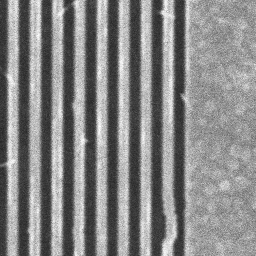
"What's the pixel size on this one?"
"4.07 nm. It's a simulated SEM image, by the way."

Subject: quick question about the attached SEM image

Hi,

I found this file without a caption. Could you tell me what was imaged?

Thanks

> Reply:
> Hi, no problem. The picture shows parallel lines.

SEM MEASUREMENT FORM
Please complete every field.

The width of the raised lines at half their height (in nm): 44.3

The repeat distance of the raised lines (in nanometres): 90.7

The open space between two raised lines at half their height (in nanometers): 44.8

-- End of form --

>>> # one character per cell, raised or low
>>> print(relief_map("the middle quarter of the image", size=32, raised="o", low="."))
...oo...ooo...oo...ooo...oo...oo
...oo...ooo...oo...ooo...oo...oo
...oo...ooo...oo...ooo...oo...oo
...oo...ooo...oo...ooo...oo...oo
...oo...ooo...oo...ooo...oo...oo
...oo...ooo...oo...ooo...oo...oo
...oo...ooo...oo...ooo...oo...oo
...oo...ooo...oo...ooo...oo...oo
...oo...ooo...oo...ooo...oo...oo
..ooo...ooo...oo...ooo...oo...oo
..ooo...ooo...oo...ooo...oo...oo
..ooo...ooo...oo...ooo...oo...oo
...oo...ooo...oo...ooo...oo...oo
...oo...ooo...oo...ooo...oo...oo
...oo...ooo...oo...ooo...oo...oo
...oo...ooo...oo...ooo...oo...oo
...oo...ooo...oo...ooo...oo...oo
...oo...ooo...oo...ooo...oo...oo
...oo...ooo...oo...ooo...oo...oo
...oo...ooo...oo...ooo...oo...oo
...oo...ooo...oo...ooo...oo...oo
...oo...ooo...oo...ooo...oo...oo
...oo...ooo...oo...ooo...oo...oo
...oo...ooo...oo...ooo...oo...oo
...oo...ooo...oo...ooo...oo...oo
...oo...ooo...oo...ooo...oo...oo
...oo...ooo...oo...ooo...oo...oo
...oo...ooo...oo...ooo...oo...oo
...oo...ooo...oo...ooo...oo...oo
...oo...ooo...oo...ooo...oo...oo
...oo...ooo...oo...ooo...oo...oo
...oo...ooo...oo...ooo...oo...oo